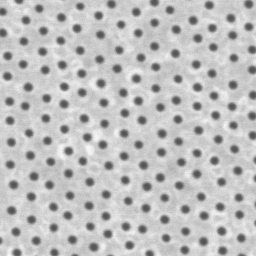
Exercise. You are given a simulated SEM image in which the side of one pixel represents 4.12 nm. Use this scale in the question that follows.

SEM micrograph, a regular array of holes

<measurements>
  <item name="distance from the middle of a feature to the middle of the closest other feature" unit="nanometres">77.2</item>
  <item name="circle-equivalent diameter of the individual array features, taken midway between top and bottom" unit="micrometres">0.0351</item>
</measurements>